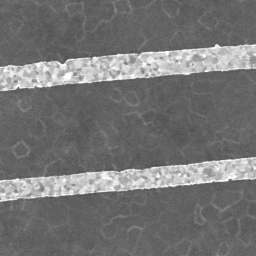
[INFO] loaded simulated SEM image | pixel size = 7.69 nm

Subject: one or a few lines or trenches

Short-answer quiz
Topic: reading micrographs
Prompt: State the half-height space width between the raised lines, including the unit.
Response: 701 nanometres